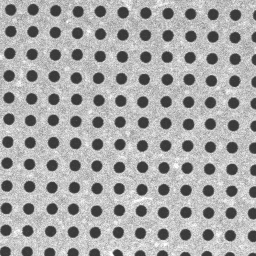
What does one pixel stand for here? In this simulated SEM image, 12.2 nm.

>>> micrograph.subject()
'a regular array of holes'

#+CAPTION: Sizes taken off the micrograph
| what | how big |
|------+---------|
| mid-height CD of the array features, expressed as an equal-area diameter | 0.145 um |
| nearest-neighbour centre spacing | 266 nm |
